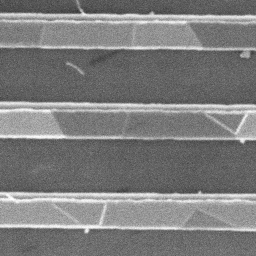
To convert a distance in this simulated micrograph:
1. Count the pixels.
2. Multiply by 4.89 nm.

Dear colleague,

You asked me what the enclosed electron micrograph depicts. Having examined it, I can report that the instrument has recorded lines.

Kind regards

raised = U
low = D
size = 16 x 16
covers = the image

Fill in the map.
DDDDDDDDDDDDDDDD
UUUUUUUUUUUUUUUU
UUUUUUUUUUUUUUUU
DDDDDDDDDDDDDDDD
DDDDDDDDDDDDDDDD
DDDDDDDDDDDDDDDD
UUUUUUDDDDDDDDDD
UUUUUUUUUUUUUUUU
UUUUUUUUUUUUUUUU
DDDDDDDDDDDDDDDD
DDDDDDDDDDDDDDDD
DDDDDDDDDDDDDDDD
UUUUUUUUUUUUUUUU
UUUUUUUUUUUUUUUU
DDDDDDDDDDDDDDDD
DDDDDDDDDDDDDDDD